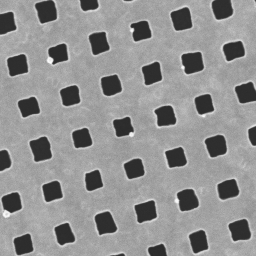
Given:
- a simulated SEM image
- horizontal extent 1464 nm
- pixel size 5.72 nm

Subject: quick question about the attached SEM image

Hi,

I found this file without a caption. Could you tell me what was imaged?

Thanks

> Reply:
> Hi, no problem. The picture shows a regular array of holes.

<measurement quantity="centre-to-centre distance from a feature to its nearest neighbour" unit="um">0.241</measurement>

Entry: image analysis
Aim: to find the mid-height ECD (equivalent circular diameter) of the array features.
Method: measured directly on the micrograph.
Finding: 0.117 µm